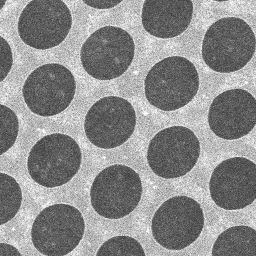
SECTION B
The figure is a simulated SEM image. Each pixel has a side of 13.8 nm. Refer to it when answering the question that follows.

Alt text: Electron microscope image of a regular array of holes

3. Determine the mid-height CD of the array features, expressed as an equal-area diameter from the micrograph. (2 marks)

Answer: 740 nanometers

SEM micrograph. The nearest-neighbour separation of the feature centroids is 952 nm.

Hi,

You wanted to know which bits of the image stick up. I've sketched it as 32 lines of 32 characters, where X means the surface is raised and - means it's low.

-XX-----XXX----XXX------XXXXXXXX
XXX------XXXXXXXXX------XXXXXXXX
XX-------XXXXXXXXX------XXX---XX
XX-------XXXX--XXX-----XXX-----X
XX------XXX-----XXX---XXXX------
-XX----XXX-------XXXXXXXX-------
--XXXXXXXX-------XXXXXXXX-------
--XXXXXXXX-------XXX----X------X
-XXXX---XX------XXX-----XX----XX
-XXX-----XX----XXX-------XXXXXXX
XXX------XXXXXXXXX-------XXXXXXX
XXX------XXXXXXXXX-------XXX---X
XXX------XXX----XX------XXX-----
-XXX----XXX------XXX---XXX------
--XXX-XXXXX------XXXXXXXXX------
--XXXXXXXXX------XXXXXXXXX------
--XXXXXXXXX------XXX----XXX----X
--XXX----XX-----XXX------XXXXXXX
-XXX------XXX-XXXXX------XXXXXXX
XXXX------XXXXXXXX-------XXXXXXX
XXX-------XXXXXXXXX-----XXX-----
XXXX------XXX----XX-----XXX-----
--XX-----XXX------XXXXXXXX------
---XXXXXXXX-------XXXXXXXX------
---XXXXXXXX-------XXXX-XXX------
---XXXX-XXX------XXX-----XX----X
--XXX-----XX----XXX------XXXXXXX
-XXX------XXXXXXXXX-------XXXXXX
XXXX-------XXXXXXXX------XXXX--X
XXXX------XXXXX-XXX------XX-----
-XXX------XXX-----XX----XXX-----
--XXX----XXX------XXXXXXXX------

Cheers